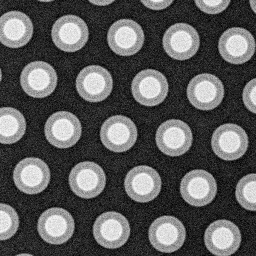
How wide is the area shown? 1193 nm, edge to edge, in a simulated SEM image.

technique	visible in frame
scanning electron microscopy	an array of small figures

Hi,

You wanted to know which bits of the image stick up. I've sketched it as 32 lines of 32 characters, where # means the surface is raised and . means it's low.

............##....###....####..#
.##.......................##....
####...###.....#................
####...####...####...###.....#..
####..#####..#####..#####...####
###....####...####..#####..#####
..............###....####..#####
............................###.
...####....##...................
...####...####...###.....##.....
...####...####..#####...####...#
...####...####...####..#####..##
...........##....###....####..##
##.......................##....#
###...###.....#.................
###...####...####...###.....#...
###...####...####...####...####.
##....####...####..#####..#####.
.............###....####...####.
...........................###..
..####....##....................
..####...####...####....##......
..####...####...####...####...##
..####...####...####...####...##
..........##....####...####...##
........................##....##
##....##........................
##...####...####...###..........
##...####...####...####...####..
##...####...####...####...####..
............###....####...####..
....................#.....###...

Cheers